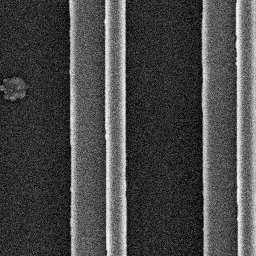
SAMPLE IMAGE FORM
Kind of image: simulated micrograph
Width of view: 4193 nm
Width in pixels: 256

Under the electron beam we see lines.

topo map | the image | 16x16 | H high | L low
LLLLHHHHLLLLLHHH
LLLLHHHHLLLLLHHH
LLLLHHHHLLLLLHHH
LLLLHHHHLLLLLHHH
LLLLHHHHLLLLLHHH
LLLLHHHHLLLLLHHH
LLLLHHHHLLLLLHHH
LLLLHHHHLLLLLHHH
LLLLHHHHLLLLLHHH
LLLLHHHHLLLLLHHH
LLLLHHHHLLLLLHHH
LLLLHHHHLLLLLHHH
LLLLHHHHLLLLLHHH
LLLLHHHHLLLLLHHH
LLLLHHHHLLLLLHHH
LLLLHHHHLLLLLHHH